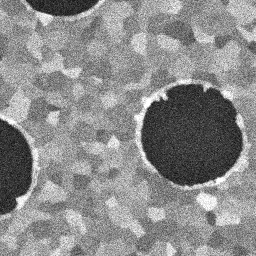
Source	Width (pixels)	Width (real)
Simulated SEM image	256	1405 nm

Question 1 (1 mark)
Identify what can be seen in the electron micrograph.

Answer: holes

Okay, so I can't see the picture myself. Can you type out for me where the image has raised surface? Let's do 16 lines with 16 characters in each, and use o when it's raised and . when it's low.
oo....oooooooooo
oooooooooooooooo
oooooooooooooooo
oooooooooooooooo
oooooooooooooooo
ooooooooooo..ooo
oooooooooo....oo
ooooooooo......o
.oooooooo......o
..ooooooo......o
..oooooooo....oo
..ooooooooo.oooo
.ooooooooooooooo
oooooooooooooooo
oooooooooooooooo
oooooooooooooooo